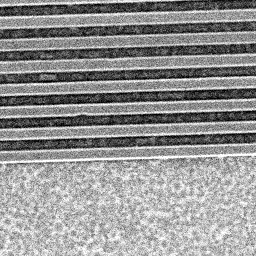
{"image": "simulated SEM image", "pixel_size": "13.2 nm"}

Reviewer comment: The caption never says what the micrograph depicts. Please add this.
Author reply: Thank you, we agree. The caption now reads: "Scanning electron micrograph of parallel lines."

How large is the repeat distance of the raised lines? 296 nm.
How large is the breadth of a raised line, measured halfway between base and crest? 152 nanometres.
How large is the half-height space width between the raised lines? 11.6 px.